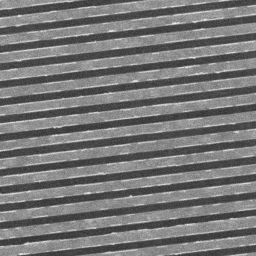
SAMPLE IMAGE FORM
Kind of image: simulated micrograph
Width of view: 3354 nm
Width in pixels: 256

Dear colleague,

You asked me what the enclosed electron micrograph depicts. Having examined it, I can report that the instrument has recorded parallel lines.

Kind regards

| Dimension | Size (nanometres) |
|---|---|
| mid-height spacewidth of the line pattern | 102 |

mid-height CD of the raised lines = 125 nanometres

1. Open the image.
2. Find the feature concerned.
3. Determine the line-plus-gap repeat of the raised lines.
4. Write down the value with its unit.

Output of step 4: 230 nm